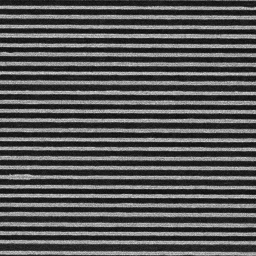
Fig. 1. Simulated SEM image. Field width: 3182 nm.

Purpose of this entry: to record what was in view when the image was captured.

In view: parallel lines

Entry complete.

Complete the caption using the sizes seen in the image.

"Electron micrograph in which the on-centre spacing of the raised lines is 117 nanometres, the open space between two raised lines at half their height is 63.7 nm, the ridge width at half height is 0.0528 microns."